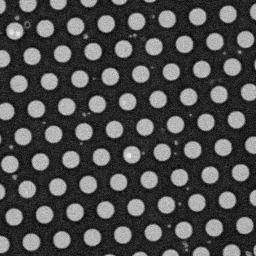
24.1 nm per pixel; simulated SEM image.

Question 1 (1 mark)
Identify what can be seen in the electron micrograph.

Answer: an array of small figures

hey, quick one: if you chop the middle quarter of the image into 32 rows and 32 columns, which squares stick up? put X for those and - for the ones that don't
-------------------------XXX----
----------XXX----XXXX----XXXX---
--XXXX----XXXX---XXXX----XXXX---
--XXXX----XXXX---XXXX-----XX----
--XXXX----XXX------X------------
---XX---------------------------
------------------------------XX
---------------X------XXX----XXX
-------XXX----XXXX----XXX----XXX
XX----XXXX----XXXX----XXX-----XX
XXX---XXXX----XXXX----XXX-------
XXX----XXX----------------------
XX------------------------------
---------------------------XX---
------------X------XXX----XXXX--
----XX-----XXX----XXXX----XXXX--
---XXXX----XXXX---XXXX----XXX---
---XXXX----XXX-----XX-----------
----XX--------------------------
--------------------------------
-----------------------XXX----XX
--------XX-----XXXX----XXXX---XX
XXX----XXXX----XXXX----XXXX---XX
XXXX---XXXX----XXXX----XXX------
XXXX----XXX-----XX--------------
XXX-----------------------------
----------------------------XX--
--------------------XXX----XXXX-
-----XX-----XXX----XXXX----XXXX-
----XXXX----XXXX---XXXX----XXXX-
----XXXX----XXX-----XXX---------
----XXXX-----X------------------